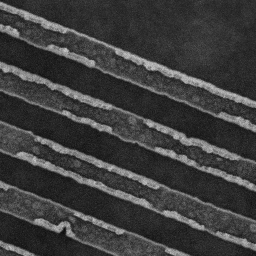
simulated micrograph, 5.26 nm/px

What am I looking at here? parallel lines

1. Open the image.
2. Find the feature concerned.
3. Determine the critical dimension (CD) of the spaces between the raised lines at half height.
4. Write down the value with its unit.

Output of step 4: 0.154 um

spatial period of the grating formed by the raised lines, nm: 292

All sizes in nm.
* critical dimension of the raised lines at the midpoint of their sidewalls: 139